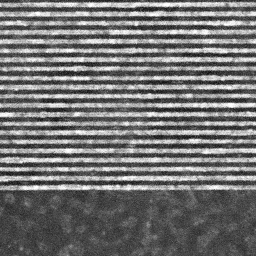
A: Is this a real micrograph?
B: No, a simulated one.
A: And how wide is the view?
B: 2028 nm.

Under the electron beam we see parallel lines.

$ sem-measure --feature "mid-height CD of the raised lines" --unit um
0.0248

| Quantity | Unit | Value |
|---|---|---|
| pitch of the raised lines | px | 9.13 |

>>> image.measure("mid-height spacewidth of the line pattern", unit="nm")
43.6